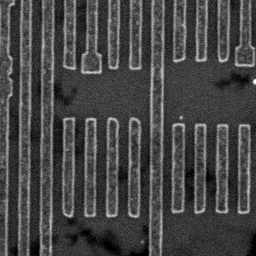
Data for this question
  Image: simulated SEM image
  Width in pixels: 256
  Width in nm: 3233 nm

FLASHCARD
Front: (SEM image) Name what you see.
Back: wiring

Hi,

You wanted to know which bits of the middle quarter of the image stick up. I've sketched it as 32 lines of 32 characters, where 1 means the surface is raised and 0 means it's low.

11101111100110000110001110000000
00001111100000000000001110000000
00000000000000000000001110000000
00000000000000000000001110000000
00000000000000000000001110000000
00000000000000000000001110000000
00000000000000000000001110000000
00000000000000000000001110000000
00000000000000000000001110000000
00000000000000000000001110000000
00000000000000000000001110000000
00000000000000000000001110000000
00000000000000000000001110000000
00000000000000000000001110000000
11000011000110000110001110000000
11000011000110000110001110001100
11000011000110000110001110011100
11000011000110000110001110011100
11000111000110000110001110011100
11000111000110000110001100011100
11000111000110000110001110011100
11000111000110000110001110011100
11000111000110000110001110011100
11000111000110000110001100011100
11000111000110000110001100011100
11000111000110001110001100011100
11000111000110001110001100011100
11000111000110001110001100011100
11000111000110001110001100011100
11000111000110001110001100011100
11000111000110001110001100011100
11000111000110001110001100011100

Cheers